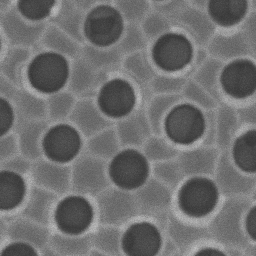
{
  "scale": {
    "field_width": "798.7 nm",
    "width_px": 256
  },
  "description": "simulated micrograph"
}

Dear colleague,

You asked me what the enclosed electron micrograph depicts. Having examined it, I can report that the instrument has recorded a regular array of holes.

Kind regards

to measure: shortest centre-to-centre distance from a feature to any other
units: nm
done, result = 226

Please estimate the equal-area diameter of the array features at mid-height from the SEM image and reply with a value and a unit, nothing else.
123 nm